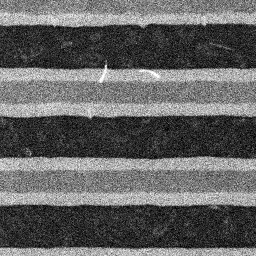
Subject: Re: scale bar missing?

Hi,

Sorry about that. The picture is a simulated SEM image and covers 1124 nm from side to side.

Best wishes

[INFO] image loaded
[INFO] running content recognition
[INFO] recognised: one or a few lines or trenches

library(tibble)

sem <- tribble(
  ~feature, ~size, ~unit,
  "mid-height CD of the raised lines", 149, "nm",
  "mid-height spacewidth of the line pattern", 246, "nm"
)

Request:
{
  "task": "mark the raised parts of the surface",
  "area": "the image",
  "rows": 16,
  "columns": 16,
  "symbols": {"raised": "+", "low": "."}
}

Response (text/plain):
++++++++++++++++
................
................
................
................
++++++++++++++++
++++++++++++++++
................
................
................
++++++++++++++++
++++++++++++++++
................
................
................
................